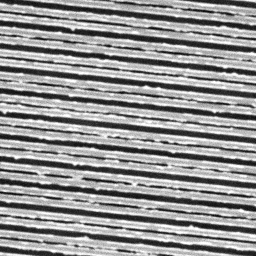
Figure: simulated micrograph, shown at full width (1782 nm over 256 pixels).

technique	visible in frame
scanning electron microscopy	parallel lines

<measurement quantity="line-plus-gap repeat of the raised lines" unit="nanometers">77.9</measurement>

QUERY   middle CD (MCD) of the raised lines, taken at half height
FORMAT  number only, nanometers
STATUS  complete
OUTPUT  48.4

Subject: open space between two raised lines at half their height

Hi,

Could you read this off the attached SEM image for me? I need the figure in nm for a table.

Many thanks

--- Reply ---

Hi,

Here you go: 41.5